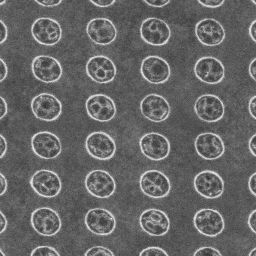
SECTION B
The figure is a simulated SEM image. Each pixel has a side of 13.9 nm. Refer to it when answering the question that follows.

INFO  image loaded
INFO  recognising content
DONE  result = a regular array of raised bodies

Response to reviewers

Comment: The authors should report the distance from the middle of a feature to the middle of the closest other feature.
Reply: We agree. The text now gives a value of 38 px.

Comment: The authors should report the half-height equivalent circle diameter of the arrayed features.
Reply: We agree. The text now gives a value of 0.382 um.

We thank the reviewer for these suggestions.